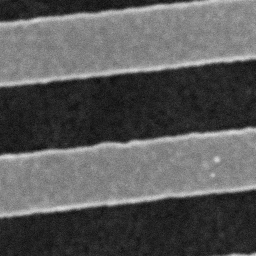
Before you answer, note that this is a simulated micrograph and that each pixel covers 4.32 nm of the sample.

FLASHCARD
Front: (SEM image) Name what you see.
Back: lines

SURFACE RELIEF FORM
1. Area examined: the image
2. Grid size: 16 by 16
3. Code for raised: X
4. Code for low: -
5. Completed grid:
---------XXXXXXX
XXXXXXXXXXXXXXXX
XXXXXXXXXXXXXXXX
XXXXXXXXXXXXXXXX
XXXXXXXX--------
----------------
----------------
----------------
-----------XXXXX
---XXXXXXXXXXXXX
XXXXXXXXXXXXXXXX
XXXXXXXXXXXXXXXX
XXXXXXXXXX------
X---------------
----------------
----------------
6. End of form